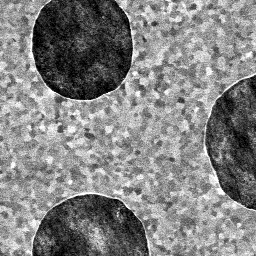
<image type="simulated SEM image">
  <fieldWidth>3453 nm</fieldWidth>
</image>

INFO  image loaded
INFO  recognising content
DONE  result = holes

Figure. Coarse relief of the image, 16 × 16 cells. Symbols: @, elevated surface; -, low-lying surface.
@@@-----@@@@@@@@
@@------@@@@@@@@
@@------@@@@@@@@
@@------@@@@@@@@
@@------@@@@@@@@
@@@----@@@@@@@--
@@@@@@@@@@@@@---
@@@@@@@@@@@@@---
@@@@@@@@@@@@@---
@@@@@@@@@@@@@---
@@@@@@@@@@@@@---
@@@@@@@@@@@@@@--
@@@@---@@@@@@@@-
@@@-----@@@@@@@@
@@-------@@@@@@@
@@-------@@@@@@@